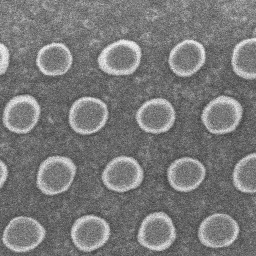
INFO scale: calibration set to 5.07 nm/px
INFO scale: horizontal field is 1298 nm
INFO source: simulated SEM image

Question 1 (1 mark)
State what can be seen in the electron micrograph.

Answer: a regular array of raised bodies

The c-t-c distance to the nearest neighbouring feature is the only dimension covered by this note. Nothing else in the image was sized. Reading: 333 nm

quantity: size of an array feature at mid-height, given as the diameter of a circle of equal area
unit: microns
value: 0.174